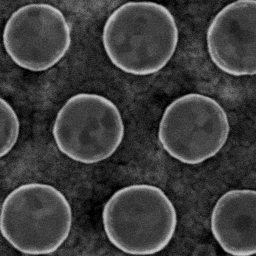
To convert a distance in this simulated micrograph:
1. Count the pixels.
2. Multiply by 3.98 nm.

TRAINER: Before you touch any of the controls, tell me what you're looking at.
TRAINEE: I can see raised bodies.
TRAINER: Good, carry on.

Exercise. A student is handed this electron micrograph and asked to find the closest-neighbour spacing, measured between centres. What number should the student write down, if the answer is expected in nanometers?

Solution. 414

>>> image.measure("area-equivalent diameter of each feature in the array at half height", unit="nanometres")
270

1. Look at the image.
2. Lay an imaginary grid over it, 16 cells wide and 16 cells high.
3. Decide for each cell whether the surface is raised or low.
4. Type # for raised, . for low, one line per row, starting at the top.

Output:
.##.....##....##
####...####..###
####...####..###
.###...####..###
........#.....##
................
....###....###..
#...####..####..
#..#####..####..
....###....###..
................
................
####...###....##
####...####..###
####...####..###
.##.....##....##